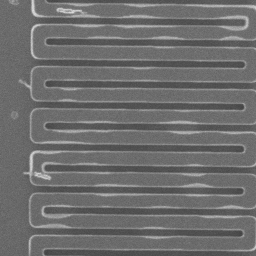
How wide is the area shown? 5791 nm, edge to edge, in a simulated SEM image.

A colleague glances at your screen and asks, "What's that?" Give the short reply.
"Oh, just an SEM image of groups of lines, slits or small figures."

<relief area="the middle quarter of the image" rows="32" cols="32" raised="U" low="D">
DDDDDDDDDDDDDDDDDDDDDDDDDDDDDDDD
UUUUUUUUUUUUUUUUUUUUUUUUUUUUUUUU
UUUUUUUUUUUUUUUUUUUUUUUUUUUUUUUU
UUUUUUUUUUUUUUUUUUUUUUUUUUUUUUUU
DDDDDDDDDDDDDDDDDDDDDDDDDDDDDDDD
DDDDDDDDDDDDDDDDDDDDDDDDDDDDDDDD
UUUUUUUUUUUUUUUUUUUUUUUUUUUUUUUU
UUUUUUUUUUUUUUUUUUUUUUUUUUUUUUUU
UUUUUUUUUUUUUUUUUUUUUUUUUUUUUUUU
DDDDDDDDDDDDDDDDDDDDDDUUUUUUUUUU
DDDDDDDDDDDDDDDDDDDDDDDDDDDDDDDD
UUUUUUUUUUUUUUUUUUDDDDDDDDDDDDDD
UUUUUUUUUUUUUUUUUUUUUUUUUUUUUUUU
UUUUUUUUUUUUUUUUUUUUUUUUUUUUUUUU
DUDDDDDDDDDUUUUUUUUUUUUUUUUUDDUU
DDDDDDDDDDDDDDDDDDDDDDDDDDDDDDDD
DDDDDDDDDDDDDDDDDDDDDDDDDDDDDDDD
UUUUUUUUUUUUUUUUUUUUUUUUUUUUUUUU
UUUUUUUUUUUUUUUUUUUUUUUUUUUUUUUU
UUUUUUUUUUUUUUUUUUUUUUUUUUUUUUUU
DDDDDDDDDDDDDDDDDDDDDDDDDDDDDDDD
DDDDDDDDDDDDDDDDDDDDDDDDDDDDDDDD
UUUUUUUUUUUUUUUUUUUUUUUUUUUUUUUU
UUUUUUUUUUUUUUUUUUUUUUUUUUUUUUUU
UUUUUUUUUUUUUUUUUUUUUUUUUUUUUUUU
DDDDDDDDDDDDDDDDDDDDDDDDDDDDDDDD
DDDDDDDDDDDDDDDDDDDDDDDDDDDDDDDD
UUUUUUUUUUUUUUUUUUUUUUUUUUUUUUDD
UUUUUUUUUUUUUUUUUUUUUUUUUUUUUUUU
UUUUUUUUUUUUUUUUUUUUUUUUUUUUUUUU
DDDDDDDDDDDDDDDDDDDUUUUUUUUUUUUD
DDDDDDDDDDDDDDDDDDDDDDDDDDDDDDDD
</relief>